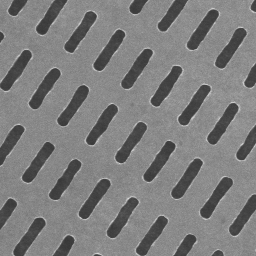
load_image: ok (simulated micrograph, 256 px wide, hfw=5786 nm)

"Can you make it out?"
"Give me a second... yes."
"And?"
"a regular array of holes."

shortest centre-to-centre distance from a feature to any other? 758 nanometers